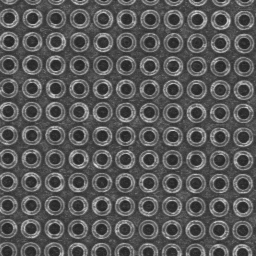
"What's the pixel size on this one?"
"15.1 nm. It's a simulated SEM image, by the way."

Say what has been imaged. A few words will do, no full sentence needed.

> a regular array of ring-shaped raised bodies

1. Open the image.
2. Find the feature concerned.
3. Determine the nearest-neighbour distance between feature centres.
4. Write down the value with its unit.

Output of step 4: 0.348 um